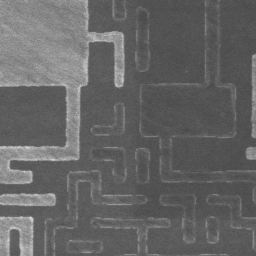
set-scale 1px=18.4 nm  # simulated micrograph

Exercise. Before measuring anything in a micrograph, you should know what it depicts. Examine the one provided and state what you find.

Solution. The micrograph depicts wiring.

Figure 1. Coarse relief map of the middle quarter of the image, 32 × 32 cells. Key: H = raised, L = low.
HHHHHLLLLLLLLHHLLLHHHLLLLLLLLLLL
HHHHHLLLLLLLLHHLLLLLLLLLLLLLLLLL
HHHHHHLLLLLLLHHLLLLLLLLLLLLLLLLL
HHHHHHLLLLLLLHHLLLLLLLLLLLLLLLLL
HHHHHHLLLLLLLHLLLLLLLLLLLLLLLLLL
HHHHLLLLLLLLLLLLLLLHHHHHHHHHHHHH
LHHHLLLLLLLLLLLLLLLHHHHHHHHHHHHH
LHHHLLLLLLLLLLLLLLLHHHHHHHHHHHHH
LHHHLLLLLLLLLLLLLLLHHHHHHHHHHHHH
LHHHLLLLLLLLLLLLLLLHHHHHHHHHHHHH
LHHHLLLLLLLLLHHLLLLHHHHHHHHHHHHH
LHHHLLLLLLLLLHHLLLLHHHHHHHHHHHHH
LHHHLLLLLLLLLHHLLLLHHHHHHHHHHHHH
LHHHLLLLLLLLLHHLLLLHHHHHHHHHHHHH
LHHHLLLLLLLLLHHLLLLHHHHHHHHHHHHH
LHHHLLLLLLLLHHHLLLLHHHHHHHHHHHHH
LHHHLLLHHHHHHHHLLLLHHHHHHHHHHHHH
LHHLLLLLLLLLLLLLLLLHHHHHHHHHHHHH
LHHLLLLLLLLLLLLLLLLLLLLLHHHLLLLL
LHHHLLLLLLLLLLLLLLLLLLLLHHLLLLLL
LHHHLLLLLLLLLLLLLLLLLLLLHHLLLLLL
HHHHLLLHHHHHHHHLLLLHHLLLHHHLLLLL
HHHHLLLHHHHHHHHLLLHHHLLLHHHLLLLL
HHHLLLLHHHHHHHHLLLHHHLLLHHHLLLLL
LLLLLLLLLLLLHHHLLLHHHLLLHHHLLLLL
LLLLLLLLLLLLHHHLLLHHHLLLHHHLLLLL
LLLLLLLLLLLLHHHLLLLHHLLLHHHLLLLL
LLHHHHHHHLLLLHHLLLHHHLLLHHHHHHHH
LHHHHHHHHLLLLHHLLLHHHLLLHHHHHHHH
LHHLLLLHHLLLLLLLLLLHLLLLLLLLLLLL
LHHLLLLHHLLLLLLLLLLLLLLLLLLLLLLL
LHHLLLLHHLLLLLLLLLLLLLLLLLLLLLLL